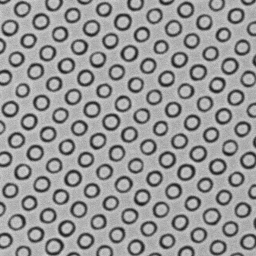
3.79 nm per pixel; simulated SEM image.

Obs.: a regular array of ring-shaped grooves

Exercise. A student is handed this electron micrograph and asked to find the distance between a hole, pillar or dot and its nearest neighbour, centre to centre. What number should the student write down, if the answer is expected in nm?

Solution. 83.6